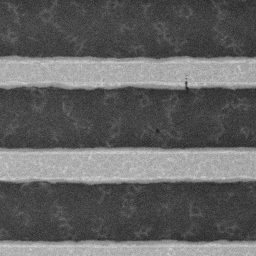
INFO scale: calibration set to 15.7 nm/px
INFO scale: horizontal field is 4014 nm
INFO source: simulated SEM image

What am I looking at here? one or a few lines or trenches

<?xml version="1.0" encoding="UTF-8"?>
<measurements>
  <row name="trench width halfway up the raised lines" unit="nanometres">1000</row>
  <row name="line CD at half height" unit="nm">435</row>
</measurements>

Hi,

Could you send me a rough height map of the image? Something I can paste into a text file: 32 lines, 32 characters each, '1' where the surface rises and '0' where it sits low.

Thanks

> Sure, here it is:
00000000000000000000000000000000
00000000000000000000000000000000
00000000000000000000000000000000
00000000000000000000000000000000
00000000000000000000000000000000
00000000000000000000000000000000
00000000000000000000000000000000
00000001111101000000011111001111
11111111111111111111111111111111
11111111111111111111111111111111
11111101111111111111111111111111
00000000000000000000000000000000
00000000000000000000000000000000
00000000000000000000000000000000
00000000000000000000000000000000
00000000000000000000000000000000
00000000000000000000000000000000
00000000000000000000000000000000
00000000000000000000000000000000
11111111111111111111111111111111
11111111111111111111111111111111
11111111111111111111111111111111
01000000111111111110000000000000
00000000000000000000000000000000
00000000000000000000000000000000
00000000000000000000000000000000
00000000000000000000000000000000
00000000000000000000000000000000
00000000000000000000000000000000
00000000000000000000000000000000
11001101101111100000111100111111
11111111111111111111111111111111